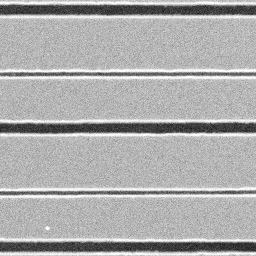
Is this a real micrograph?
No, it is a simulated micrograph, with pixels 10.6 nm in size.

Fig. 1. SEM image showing lines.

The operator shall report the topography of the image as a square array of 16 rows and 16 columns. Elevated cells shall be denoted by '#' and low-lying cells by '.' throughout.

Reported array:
................
################
################
################
################
################
################
################
################
################
################
################
################
################
################
................